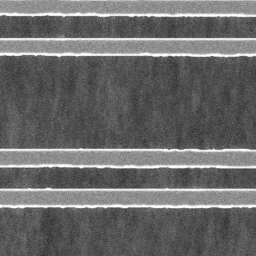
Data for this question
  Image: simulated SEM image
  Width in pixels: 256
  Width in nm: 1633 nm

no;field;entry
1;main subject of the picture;lines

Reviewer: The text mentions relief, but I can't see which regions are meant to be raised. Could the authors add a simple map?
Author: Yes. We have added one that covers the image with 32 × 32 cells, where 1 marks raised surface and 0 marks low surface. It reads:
11111111111111111111111111111111
11111111111111111111111111111111
00000000000000000000000000000000
00000000000000000000000000000000
00000000000000000000000000000000
11111111111111111111111111111111
11111111111111111111111111111111
00000000000000000000000000000000
00000000000000000000000000000000
00000000000000000000000000000000
00000000000000000000000000000000
00000000000000000000000000000000
00000000000000000000000000000000
00000000000000000000000000000000
00000000000000000000000000000000
00000000000000000000000000000000
00000000000000000000000000000000
00000000000000000000000000000000
00000000000000000000000000000000
11111111111111111111111111111111
11111111111111111111111111111111
00000000000000000000000000000000
00000000000000000000000000000000
00000000000000000000000000000000
11111111111111111111111111111111
11111111111111111111111111111111
00000000000000000000000000000000
00000000000000000000000000000000
00000000000000000000000000000000
00000000000000000000000000000000
00000000000000000000000000000000
00000000000000000000000000000000